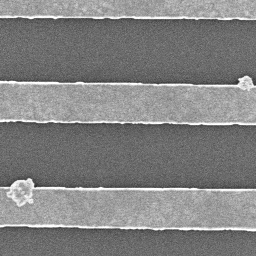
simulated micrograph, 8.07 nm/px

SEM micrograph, lines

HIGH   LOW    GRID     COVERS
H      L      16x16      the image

HHHHHHHHHHHHHHHH
LLLLLLLLLLLLLLLL
LLLLLLLLLLLLLLLL
LLLLLLLLLLLLLLLL
LLLLLLLLLLLLLLLL
HHHHHHHHHHHHHHHH
HHHHHHHHHHHHHHHH
HHHHHHHHHHHHHHHH
LLLLLLLLLLLLLLLL
LLLLLLLLLLLLLLLL
LLLLLLLLLLLLLLLL
LHLLLLLLLLLLLLLL
HHHHHHHHHHHHHHHH
HHHHHHHHHHHHHHHH
LLLLLLLLLLLLLLLL
LLLLLLLLLLLLLLLL